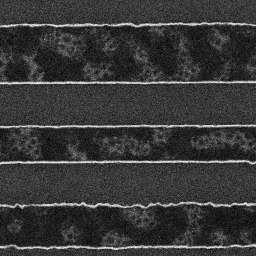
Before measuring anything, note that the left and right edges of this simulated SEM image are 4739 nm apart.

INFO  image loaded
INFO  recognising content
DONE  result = one or a few lines or trenches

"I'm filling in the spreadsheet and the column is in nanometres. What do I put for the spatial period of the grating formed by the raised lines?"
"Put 1590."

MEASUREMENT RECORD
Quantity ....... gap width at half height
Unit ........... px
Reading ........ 43.6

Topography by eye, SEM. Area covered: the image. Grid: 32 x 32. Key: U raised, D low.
DDDDDDDDDDDDDDDDDDDDDDDDDDDDDDDD
DDDDDDDDDDDDDDDDDDDDDDDDDDDDDDDD
DDDDDDDDDDDDDDDDDDDDDDDDDDDDDDDD
UUUUUUUUUUUUUUUUUUUUUUUUUUUUUUUU
UUUUUUUUUUUUUUUUUUUUUUUUUUUUUUUU
UUUUUUUUUUUUUUUUUUUUUUUUUUUUUUUU
UUUUUUUUUUUUUUUUUUUUUUUUUUUUUUUU
UUUUUUUUUUUUUUUUUUUUUUUUUUUUUUUU
UUUUUUUUUUUUUUUUUUUUUUUUUUUUUUUU
UUUUUUUUUUUUUUUUUUUUUUUUUUUUUUUU
DDDDDDDDDDDDDDDDDDDDDDDDDDDDDDDD
DDDDDDDDDDDDDDDDDDDDDDDDDDDDDDDD
DDDDDDDDDDDDDDDDDDDDDDDDDDDDDDDD
DDDDDDDDDDDDDDDDDDDDDDDDDDDDDDDD
DDDDDDDDDDDDDDDDDDDDDDDDDDDDDDDD
DDDDDDDDDDDDDDDDDDDDDDDDDDDDDDDD
UUUUUUUUUUUUUUUUUUUUUUUUUUUUUUUU
UUUUUUUUUUUUUUUUUUUUUUUUUUUUUUUU
UUUUUUUUUUUUUUUUUUUUUUUUUUUUUUUU
UUUUUUUUUUUUUUUUUUUUUUUUUUUUUUUU
DDDDDDDDDDDDDDDDDDDDDDDDDDDDDDDD
DDDDDDDDDDDDDDDDDDDDDDDDDDDDDDDD
DDDDDDDDDDDDDDDDDDDDDDDDDDDDDDDD
DDDDDDDDDDDDDDDDDDDDDDDDDDDDDDDD
DDDDDDDDDDDDDDDDDDDDDDDDDDDDDDDD
DDDDDDDDDDDDDDDDDDDDDDUUUDDDDUUD
UUUUUUUUUUUUUUUUUUUUUUUUUUUUUUUU
UUUUUUUUUUUUUUUUUUUUUUUUUUUUUUUU
UUUUUUUUUUUUUUUUUUUUUUUUUUUUUUUU
UUUUUUUUUUUUUUUUUUUUUUUUUUUUUUUU
UUUUUUUUUUUUUUUUUUUUUUUUUUUUUUUU
DDDDDDDDDDDDDDDDDDDDDDDDDDDDDDDD